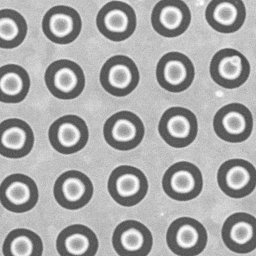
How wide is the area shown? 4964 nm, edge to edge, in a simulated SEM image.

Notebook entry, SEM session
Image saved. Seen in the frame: an array of small figures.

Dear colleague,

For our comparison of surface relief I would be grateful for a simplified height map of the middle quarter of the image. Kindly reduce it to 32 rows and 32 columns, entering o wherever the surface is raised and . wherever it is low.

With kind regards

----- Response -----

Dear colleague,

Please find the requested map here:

....oooooo........ooooo...oooo..
.....oooo...oooo...oooo..ooooo..
oo...oooo...oooo...oooo...oooo..
ooo..oooo...oooo...oooo...oooo..
ooo..oooo...oooo...oooo....oo...
oo...oooo....oo...oooooo.......o
o....ooooo.......oooooooo......o
....ooooooo.....oooooooooooooooo
...ooooooooooooooooooooooooooooo
oooooooooooooooooooooooooooooooo
oooooooooooooooooooooooooooo.ooo
oooooooooooooo.ooooooooooo.....o
oooooooooooo......ooooooo.......
....ooooooo........ooooo....o...
.....ooooo....o.....oooo..ooooo.
oo....oooo...oooo...ooo...ooooo.
ooo...oooo...oooo...ooo....oooo.
ooo...oooo...ooooo..oooo...oooo.
ooo...oooo...oooo...oooo........
ooo...ooooo........oooooo.......
.....oooooo.......oooooooo.....o
....ooooooooo...oooooooooooooooo
..oooooooooooooooooooooooooooooo
oooooooooooooooooooooooooooooooo
oooooooooooooooooooooooooooo...o
oooooooooooooo...oooooooooo.....
o..ooooooooo.......ooooooo......
.....ooooooo........ooooo...ooo.
......ooooo....ooo...oooo..ooooo
.oo....oooo...oooo...ooo...ooooo
oooo...oooo...oooo...ooo...ooooo
ooooo..oooo...oooo...oooo...ooo.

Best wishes